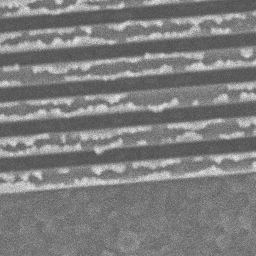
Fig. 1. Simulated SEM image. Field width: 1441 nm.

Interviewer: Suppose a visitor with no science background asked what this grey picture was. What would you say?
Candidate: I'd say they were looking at parallel lines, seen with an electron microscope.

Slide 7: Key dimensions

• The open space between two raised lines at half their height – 0.0813 µm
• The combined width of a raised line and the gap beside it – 196 nm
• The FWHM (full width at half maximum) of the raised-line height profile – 114 nanometres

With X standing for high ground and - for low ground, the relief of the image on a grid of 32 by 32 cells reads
XXXXXXXXXXXXXXXXXXXX------------
XXXXXXXX------------------------
--------------------XXXXXXXXXXXX
--------XXXXXXXXXXXXXXXXXXXXXXXX
XXXXXXXXXXXXXXXXXXXXXXXXXX------
XXXXXXXXXXXXXX------------------
XX----------------------XXXXXXXX
------------XXXXXXXXXXXXXXXXXXXX
XXXXXXXXXXXXXXXXXXXXXXXXXXXXX---
XXXXXXXXXXXXXXXXXX--------------
XXXXXX----------------------XXXX
----------------XXXXXXXXXXXXXXXX
----XXXXXXXXXXXXXXXXXXXXXXXXXXXX
XXXXXXXXXXXXXXXXXXXXXX----------
XXXXXXXXXX----------------------
---------------------XXXXXXXXXXX
---------XXXXXXXXXXXXXXXXXXXXXXX
XXXXXXXXXXXXXXXXXXXXXXXXX-------
XXXXXXXXXXXXXX------------------
XXX----------------------XXXXXXX
-------------XXXXXXXXXXXXXXXXXXX
-XXXXXXXXXXXXXXXXXXXXXXXXXXXXX--
XXXXXXXXXXXXXXXXXX--------------
XXXXXXX-------------------------
--------------------------------
--------------------------------
--------------------------------
--------------------------------
--------------------------------
--------------------------------
--------------------------------
--------------------------------